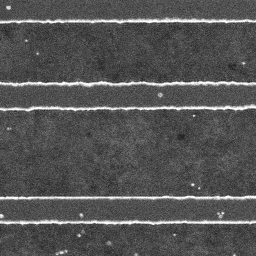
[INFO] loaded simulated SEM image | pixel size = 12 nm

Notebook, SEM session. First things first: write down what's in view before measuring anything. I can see lines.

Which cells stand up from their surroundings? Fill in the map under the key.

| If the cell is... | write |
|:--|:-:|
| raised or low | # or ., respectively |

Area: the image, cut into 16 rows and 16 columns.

################
................
................
................
................
################
################
................
................
................
................
................
################
################
................
................